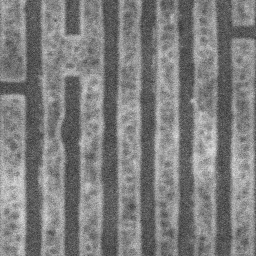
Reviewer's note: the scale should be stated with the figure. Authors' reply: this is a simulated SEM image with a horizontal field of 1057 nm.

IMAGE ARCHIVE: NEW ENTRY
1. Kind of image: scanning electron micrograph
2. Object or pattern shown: parallel lines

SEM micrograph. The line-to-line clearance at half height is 0.078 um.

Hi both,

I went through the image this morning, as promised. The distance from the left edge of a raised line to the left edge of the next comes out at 158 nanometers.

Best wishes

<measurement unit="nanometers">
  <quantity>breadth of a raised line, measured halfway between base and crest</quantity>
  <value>78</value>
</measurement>